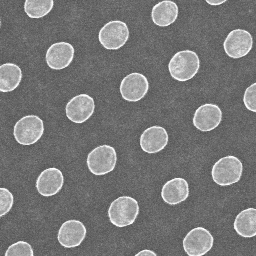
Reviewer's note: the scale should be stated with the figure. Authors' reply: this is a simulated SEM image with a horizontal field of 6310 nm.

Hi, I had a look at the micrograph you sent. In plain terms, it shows a regular array of raised bodies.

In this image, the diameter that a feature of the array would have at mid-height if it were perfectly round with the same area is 0.67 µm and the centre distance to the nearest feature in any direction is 1.37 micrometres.